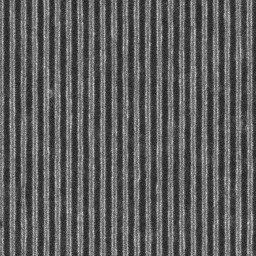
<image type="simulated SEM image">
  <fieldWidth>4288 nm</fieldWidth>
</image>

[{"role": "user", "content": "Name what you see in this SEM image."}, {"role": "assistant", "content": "parallel lines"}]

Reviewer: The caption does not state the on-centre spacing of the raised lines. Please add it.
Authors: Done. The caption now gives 189 nanometers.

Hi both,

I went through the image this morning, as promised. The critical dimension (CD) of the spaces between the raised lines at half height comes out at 0.0461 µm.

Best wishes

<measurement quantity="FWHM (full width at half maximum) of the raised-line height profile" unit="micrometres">0.138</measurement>